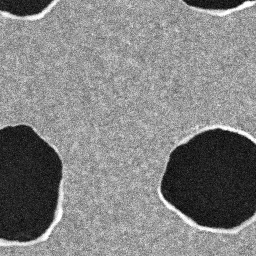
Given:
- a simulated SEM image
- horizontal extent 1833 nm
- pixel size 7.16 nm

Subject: holes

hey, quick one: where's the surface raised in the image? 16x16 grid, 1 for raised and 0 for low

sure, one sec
0001111111110001
1111111111111111
1111111111111111
1111111111111111
1111111111111111
1111111111111111
1111111111111111
1111111111111111
0011111111110001
0000111111100000
0000111111000000
0000111111000000
0000111111000000
0000111111110000
0001111111111111
1111111111111111